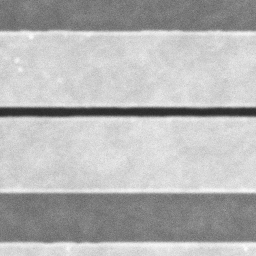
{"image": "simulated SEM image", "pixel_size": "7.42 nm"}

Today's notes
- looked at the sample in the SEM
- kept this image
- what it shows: lines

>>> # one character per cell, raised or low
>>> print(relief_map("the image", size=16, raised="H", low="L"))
LLLLLLLLLLLLLLLL
LLLLLLLLLLLLLLLL
HHHHHHHHHHHHHHHH
HHHHHHHHHHHHHHHH
HHHHHHHHHHHHHHHH
HHHHHHHHHHHHHHHH
HHHHHHHHHHHHHHHH
HHHHHHHHHHHHHHHH
HHHHHHHHHHHHHHHH
HHHHHHHHHHHHHHHH
HHHHHHHHHHHHHHHH
HHHHHHHHHHHHHHHH
LLLLLLLLLLLLLLLL
LLLLLLLLLLLLLLLL
LLLLLLLLLLLLLLLL
HHHHHHHHHHHHHHHH